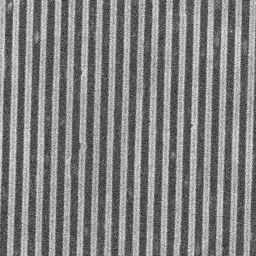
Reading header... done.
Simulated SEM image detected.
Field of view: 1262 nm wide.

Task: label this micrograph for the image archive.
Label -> parallel lines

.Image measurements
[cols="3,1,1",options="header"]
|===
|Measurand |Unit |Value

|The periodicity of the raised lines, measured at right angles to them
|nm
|68.5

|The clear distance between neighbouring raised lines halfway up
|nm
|44.3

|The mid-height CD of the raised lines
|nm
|26.5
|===